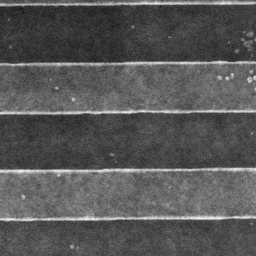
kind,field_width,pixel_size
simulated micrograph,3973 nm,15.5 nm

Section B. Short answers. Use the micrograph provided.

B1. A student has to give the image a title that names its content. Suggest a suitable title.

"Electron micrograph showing lines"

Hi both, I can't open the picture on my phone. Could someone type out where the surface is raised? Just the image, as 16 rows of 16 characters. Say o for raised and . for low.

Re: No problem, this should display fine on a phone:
................
................
................
................
oooooooooooooooo
oooooooooooooooo
oooooooooooooooo
................
................
................
................
oooooooooooooooo
oooooooooooooooo
oooooooooooooooo
................
................